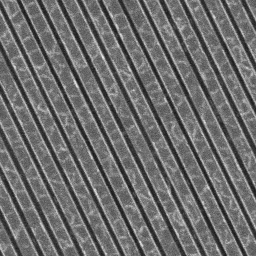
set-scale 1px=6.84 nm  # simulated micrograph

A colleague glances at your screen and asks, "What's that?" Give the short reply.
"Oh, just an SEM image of parallel lines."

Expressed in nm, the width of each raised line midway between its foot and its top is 92.2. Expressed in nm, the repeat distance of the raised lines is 125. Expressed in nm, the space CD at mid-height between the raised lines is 30.7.